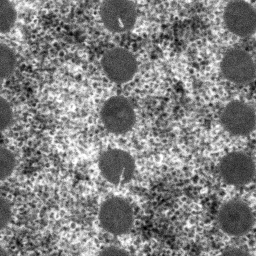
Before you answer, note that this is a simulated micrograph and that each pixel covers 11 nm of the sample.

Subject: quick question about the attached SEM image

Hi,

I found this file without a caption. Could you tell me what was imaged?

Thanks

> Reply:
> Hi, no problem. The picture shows raised bodies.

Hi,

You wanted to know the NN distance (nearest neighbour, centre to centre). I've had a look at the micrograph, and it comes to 0.536 microns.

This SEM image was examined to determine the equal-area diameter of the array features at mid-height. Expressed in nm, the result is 445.